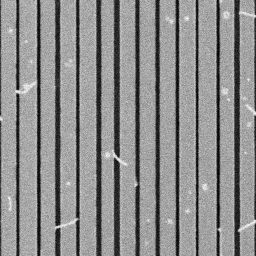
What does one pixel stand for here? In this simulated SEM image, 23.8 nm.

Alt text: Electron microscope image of parallel lines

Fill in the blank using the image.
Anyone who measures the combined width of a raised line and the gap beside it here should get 473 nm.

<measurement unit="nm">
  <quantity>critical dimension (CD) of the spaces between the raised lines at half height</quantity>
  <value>113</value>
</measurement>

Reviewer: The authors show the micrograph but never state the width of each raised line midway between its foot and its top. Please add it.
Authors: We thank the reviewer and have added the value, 15.4 px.